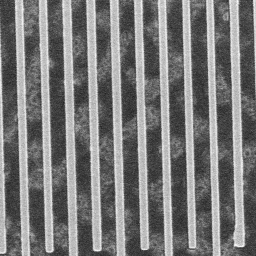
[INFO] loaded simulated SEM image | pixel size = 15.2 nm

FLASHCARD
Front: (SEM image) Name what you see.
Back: parallel lines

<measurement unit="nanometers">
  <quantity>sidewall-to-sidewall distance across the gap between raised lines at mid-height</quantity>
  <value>247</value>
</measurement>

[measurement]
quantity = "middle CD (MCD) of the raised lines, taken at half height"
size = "112 nanometres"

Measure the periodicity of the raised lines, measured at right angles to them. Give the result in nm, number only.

362